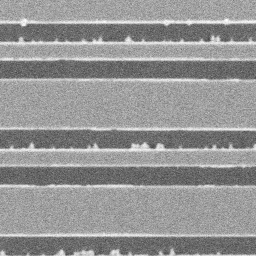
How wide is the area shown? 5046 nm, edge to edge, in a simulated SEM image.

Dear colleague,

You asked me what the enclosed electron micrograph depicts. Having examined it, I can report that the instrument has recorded lines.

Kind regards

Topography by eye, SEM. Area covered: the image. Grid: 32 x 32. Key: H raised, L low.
HHHHHHHHHHHHHHHHHHHHHHHHHHHHHHHH
HHHHHHHHHHHHHHHHHHHHHHHHHHHHHHHH
HHHHHHHHHHHHHHHHHHHHHHHHHHHHHHHH
LLLLLLLLLLLLLLLLLLLLLLLLLLLLLLLL
LLLLLLLLLLLLLLLLLLLLLLLLLLLLLLLL
HHHHHHHHHHHHHHHHHHHHHHHHHHHHHHHH
HHHHHHHHHHHHHHHHHHHHHHHHHHHHHHHH
LLLLLLLLLLLLLLLLLLLLLLLLLLLLLLLL
LLLLLLLLLLLLLLLLLLLLLLLLLLLLLLLL
LLLLLLLLLLLLLLLLLLLLLLLLLLLLLLLL
HHHHHHHHHHHHHHHHHHHHHHHHHHHHHHHH
HHHHHHHHHHHHHHHHHHHHHHHHHHHHHHHH
HHHHHHHHHHHHHHHHHHHHHHHHHHHHHHHH
HHHHHHHHHHHHHHHHHHHHHHHHHHHHHHHH
HHHHHHHHHHHHHHHHHHHHHHHHHHHHHHHH
HHHHHHHHHHHHHHHHHHHHHHHHHHHHHHHH
LLLLLLLLLLLLLLLLLLLLLLLLLLLLLLLL
LLLLLLLLLLLLLLLLLLLLLLLLLLLLLLLL
LLLLLLLLLLLLLLLLHHHLLLLLLLLLLLLL
HHHHHHHHHHHHHHHHHHHHHHHHHHHHHHHH
HHHHHHHHHHHHHHHHHHHHHHHHHHHHHHHH
LLLLLLLLLLLLLLLLLLLLLLLLLLLLLLLL
LLLLLLLLLLLLLLLLLLLLLLLLLLLLLLLL
HHHHHHHHHHHHHHHHHHHHHHHHHHHHHHHH
HHHHHHHHHHHHHHHHHHHHHHHHHHHHHHHH
HHHHHHHHHHHHHHHHHHHHHHHHHHHHHHHH
HHHHHHHHHHHHHHHHHHHHHHHHHHHHHHHH
HHHHHHHHHHHHHHHHHHHHHHHHHHHHHHHH
HHHHHHHHHHHHHHHHHHHHHHHHHHHHHHHH
LLLLLLLLLLLLLLLLLLLLLLLLLLLLLLLL
LLLLLLLLLLLLLLLLLLLLLLLLLLLLLLLL
LLLLLLLLLLLLLLLLLLLLLLLLLLLLLLLL